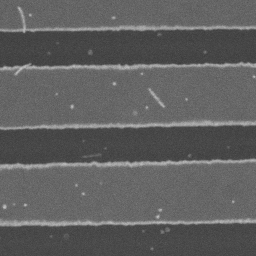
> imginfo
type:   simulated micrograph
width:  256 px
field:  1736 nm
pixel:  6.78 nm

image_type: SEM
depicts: lines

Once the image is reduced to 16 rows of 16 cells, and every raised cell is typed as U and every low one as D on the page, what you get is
UUUUUUUUUUUUUUUU
UUUUUUUUUUUUUUUU
DDDDDDDDDDDDDDDD
DDDDDDDDDDDDDDDD
UUUUUUUUUUUUUUUU
UUUUUUUUUUUUUUUU
UUUUUUUUUUUUUUUU
UUUUUUUUUUUUUUUU
DDDDDDDDDDDDDDDD
DDDDDDDDDDDDDDDD
UUUUUUUUUUUUUUUU
UUUUUUUUUUUUUUUU
UUUUUUUUUUUUUUUU
UUUUUUUUUUUUUUUU
DDDDDDDDDDDDDDDD
DDDDDDDDDDDDDDDD